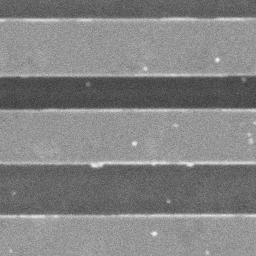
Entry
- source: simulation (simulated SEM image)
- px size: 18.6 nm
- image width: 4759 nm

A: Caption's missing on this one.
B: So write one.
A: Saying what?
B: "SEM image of lines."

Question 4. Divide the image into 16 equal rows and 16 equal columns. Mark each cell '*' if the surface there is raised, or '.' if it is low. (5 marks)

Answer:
................
****************
****************
****************
****************
................
................
****************
****************
****************
................
................
................
.......*.*.*****
****************
****************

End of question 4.